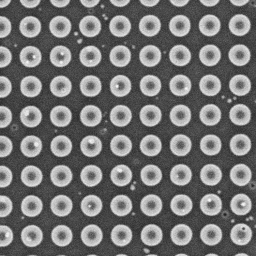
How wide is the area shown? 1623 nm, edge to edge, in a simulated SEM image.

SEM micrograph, an array of small figures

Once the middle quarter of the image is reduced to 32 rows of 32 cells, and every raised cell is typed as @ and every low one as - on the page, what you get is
-----@@@-----@@------@----------
--------------------------------
--------------------------------
@----@@@----@@@@----@@@----@@@@-
@@--@@@@@---@@@@@--@@@@@---@@@@-
@@--@@@@@---@@@@@--@@@@@---@@@@@
@@--@@@@@---@@@@@--@@@@@---@@@@-
@----@@@----@@@@----@@@-----@@@-
--------------------------------
--------------------------------
------@------@@------@@-----@@--
@----@@@@---@@@@---@@@@@---@@@@-
@@--@@@@@---@@@@@--@@@@@---@@@@@
@@--@@@@@---@@@@@--@@@@@---@@@@@
@----@@@@---@@@@----@@@@---@@@@-
-------------@@-----------------
--------------------------------
--------------------------------
@----@@@----@@@@----@@@----@@@@-
@@--@@@@@---@@@@@--@@@@@---@@@@@
@@--@@@@@---@@@@@--@@@@@---@@@@@
@@--@@@@@---@@@@@--@@@@@---@@@@-
@----@@@-----@@@----@@@-----@@@-
--------------------------------
--------------------------------
------@@-----@@------@@-----@@@-
@@---@@@@---@@@@@--@@@@@---@@@@@
@@--@@@@@---@@@@@--@@@@@---@@@@@
@@--@@@@@---@@@@@--@@@@@---@@@@@
@----@@@@---@@@@----@@@@---@@@@-
------@-------------------------
--------------------------------